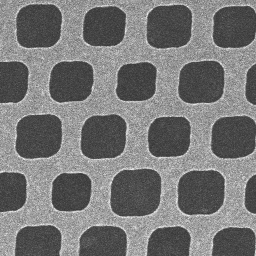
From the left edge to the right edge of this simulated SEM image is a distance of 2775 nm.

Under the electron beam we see a regular array of holes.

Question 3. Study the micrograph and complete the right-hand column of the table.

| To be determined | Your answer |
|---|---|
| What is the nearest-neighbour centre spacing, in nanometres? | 692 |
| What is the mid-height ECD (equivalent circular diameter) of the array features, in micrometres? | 0.513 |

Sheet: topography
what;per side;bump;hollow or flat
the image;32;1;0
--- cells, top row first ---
11110011111111111111111111111111
11000000111000011110000011100000
11000000111000001100000011100000
11000000110000001100000011100000
11000000110000001100000011100000
11000001111000011110000111100001
11111111111111111111111111111111
11111111111111111111111111111111
00011110000011100001111000001110
00001100000011100000110000001110
00001100000011100001110000001110
00011100000111000001110000001110
00011110001111100011111000011110
11111111111111111111111111111111
11100001111100011111111111111001
11000000110000001110000011100000
11000000110000001110000011000000
11000000110000001100000011000000
11000000110000001110000011000000
11100011111000011110000111100001
11111111111111111111111111111111
10111111111111100000111000011111
00011110000111000000110000001110
00011110000111000000110000001110
00011100000111000000110000001110
00011110000111000000110000001110
11111111111111000001111000011110
11111111111111111111111111111111
11100001111000011111000111110001
11000000110000001110000011100000
11000000110000001100000011100000
11000000110000001100000011000000